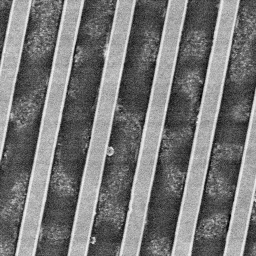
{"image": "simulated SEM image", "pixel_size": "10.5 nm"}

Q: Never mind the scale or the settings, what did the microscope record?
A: parallel lines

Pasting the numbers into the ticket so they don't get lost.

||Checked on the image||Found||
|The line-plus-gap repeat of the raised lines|0.538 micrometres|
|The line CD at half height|178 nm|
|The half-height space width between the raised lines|355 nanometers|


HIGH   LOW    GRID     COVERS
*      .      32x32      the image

..**....**.....**....**.....**..
.***....**....***....**....***..
.**.....**....**.....**....**...
.**.....**....**.....**....**...
.**....**.....**....**.....**...
.**....**.....**....**.....**...
***....**....***....**.....**...
**.....**....**.....**....**....
**.....**....**.....**....**....
**....***....**....***....**....
**....**.....**....**.....**....
**....**.....**....**.....**....
*.....**....**.....**....**.....
*.....**....**.....**....**.....
*....***....**....***....**....*
*....**.....**....**.....**....*
*....**.....**....**.....**....*
.....**....***....**....***....*
.....**....**.....**....**.....*
.....**....**....***....**....**
....**.....**....**.....**....**
....**.....**....**.....**....**
....**....***....**....***....**
....**....**.....**....**.....**
....**....**....***....**....***
...***....**....**.....**....***
...**.....**....**.....**....**.
...**....***....**....***....**.
...**....**.....**....**.....**.
..***....**....***....**....***.
..***....**....***....**....***.
..**.....**....**.....**....**..